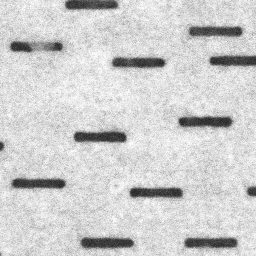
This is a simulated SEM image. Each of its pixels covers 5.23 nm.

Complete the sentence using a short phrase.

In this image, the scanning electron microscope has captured a regular array of holes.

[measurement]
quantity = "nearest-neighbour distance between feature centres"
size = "0.4 microns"